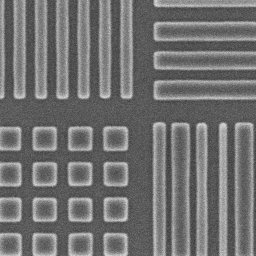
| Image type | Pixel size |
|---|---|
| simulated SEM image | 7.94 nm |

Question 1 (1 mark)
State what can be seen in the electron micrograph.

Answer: groups of lines, slits or small figures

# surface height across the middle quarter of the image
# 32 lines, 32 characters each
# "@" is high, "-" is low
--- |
@---@@---@@---@@@------@@@@@@@@@
@---@@---@@---@@@---------------
@---@@---@@---@@@---------------
@---@@---@@---@@@---------------
@---@@---@@---@@@------@@@@@@@@@
@---@@---@@---@@@------@@@@@@@@@
@---@@---@@---@@@------@@@@@@@@@
@---@@---@@---@@@------@@@@@@@@@
@----------------------@@@@@@@@@
--------------------------------
--------------------------------
--------------------------------
--------------------------------
--------------------------------
--------------------------------
----------------------@@@--@@@@-
-@@@@@@---@@@@@@------@@@--@@@@-
-@@@@@@---@@@@@@------@@@--@@@@-
-@@@@@@---@@@@@@------@@@--@@@@-
-@@@@@@---@@@@@@------@@@--@@@@-
-@@@@@@---@@@@@@-------@@--@@@@-
--@@@@@----@@@@-------@@@--@@@@-
----------------------@@@--@@@@-
----------------------@@@--@@@@-
----------------------@@@--@@@@-
-@@@@@@---@@@@@@------@@@--@@@@-
-@@@@@@---@@@@@@------@@@--@@@@-
-@@@@@@---@@@@@@------@@@--@@@@-
-@@@@@@---@@@@@@------@@@--@@@@-
-@@@@@@---@@@@@@------@@@--@@@@-
----------------------@@@--@@@@-
----------------------@@@--@@@@-